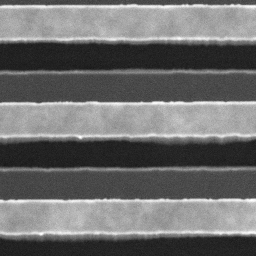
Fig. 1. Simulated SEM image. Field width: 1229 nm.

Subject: lines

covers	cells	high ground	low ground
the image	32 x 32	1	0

11111111111111111111111111111111
11111111111111111111111111111111
11111111111111111111111111111111
11111111111111111111111111111111
11111111111111111111111111111111
00000000000000000000000000000000
00000000000000000000000000000000
00000000000000000000000000000000
00000000000000000000000000000000
11111111111111111111111111111111
11111111111111111111111111111111
11111111111111111111111111111111
11111111111111111111111111111111
11111111111111111111111111111111
11111111111111111111111111111111
11111111111111111111111111111111
11111111111111111111111111111111
00000000000000000000000000000000
00000000000000000000000000000000
00000000000000000000000000000000
00000000000000000000000000000000
11111111111111111111111111111111
11111111111111111111111111111111
11111111111111111111111111111111
11111111111111111111111111111111
11111111111111111111111111111111
11111111111111111111111111111111
11111111111111111111111111111111
11111111111111111111111111111111
00000000000000000000000000000000
00000000000000000000000000000000
00000000000000000000000000000000